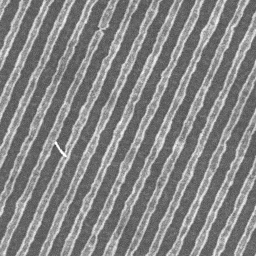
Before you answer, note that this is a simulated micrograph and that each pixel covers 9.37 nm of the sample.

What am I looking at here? parallel lines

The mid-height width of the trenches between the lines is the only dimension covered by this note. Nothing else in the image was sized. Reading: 121 nm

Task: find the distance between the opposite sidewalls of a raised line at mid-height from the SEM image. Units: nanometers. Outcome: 64.1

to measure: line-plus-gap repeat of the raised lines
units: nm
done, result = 185